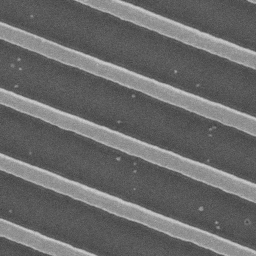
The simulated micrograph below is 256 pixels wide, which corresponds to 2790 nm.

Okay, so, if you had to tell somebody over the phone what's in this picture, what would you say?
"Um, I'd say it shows lines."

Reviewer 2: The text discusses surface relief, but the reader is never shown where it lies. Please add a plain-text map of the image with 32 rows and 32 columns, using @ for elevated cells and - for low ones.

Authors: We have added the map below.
-----------@@@@@----------------
-------------@@@@@@-------------
----------------@@@@@-----------
@@----------------@@@@@@--------
@@@@@----------------@@@@@------
--@@@@@-----------------@@@@@---
----@@@@@@----------------@@@@@@
-------@@@@@-----------------@@@
----------@@@@@----------------@
------------@@@@@@--------------
---------------@@@@@@-----------
@-----------------@@@@@---------
@@@@----------------@@@@@@------
--@@@@@----------------@@@@@@---
----@@@@@----------------@@@@@@-
-------@@@@@----------------@@@@
---------@@@@@@----------------@
------------@@@@@---------------
--------------@@@@@@------------
@----------------@@@@@@---------
@@@----------------@@@@@@-------
-@@@@@----------------@@@@@@----
---@@@@@@----------------@@@@@@-
------@@@@@----------------@@@@@
---------@@@@@----------------@@
-----------@@@@@@---------------
--------------@@@@@-------------
@---------------@@@@@@----------
@@@----------------@@@@@@-------
@@@@@@---------------@@@@@@-----
---@@@@@----------------@@@@@@--
-----@@@@@@----------------@@@@@